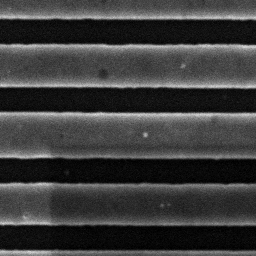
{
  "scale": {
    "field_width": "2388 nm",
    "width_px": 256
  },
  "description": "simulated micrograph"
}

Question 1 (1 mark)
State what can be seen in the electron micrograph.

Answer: lines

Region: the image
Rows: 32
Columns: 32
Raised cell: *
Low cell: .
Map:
********************************
********************************
................................
................................
................................
................................
********************************
********************************
********************************
********************************
********************************
................................
................................
................................
********************************
********************************
********************************
********************************
********************************
********************************
................................
................................
................................
********************************
********************************
********************************
********************************
********************************
................................
................................
................................
********************************